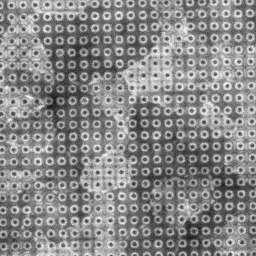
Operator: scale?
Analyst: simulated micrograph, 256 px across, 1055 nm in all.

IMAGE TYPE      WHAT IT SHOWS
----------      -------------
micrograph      a regular array of holes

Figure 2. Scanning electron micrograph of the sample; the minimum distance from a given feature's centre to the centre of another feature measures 48.5 nm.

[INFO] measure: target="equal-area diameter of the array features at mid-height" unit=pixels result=5.66